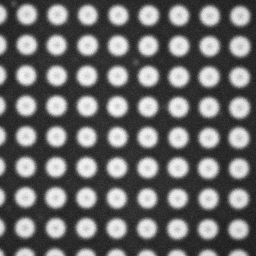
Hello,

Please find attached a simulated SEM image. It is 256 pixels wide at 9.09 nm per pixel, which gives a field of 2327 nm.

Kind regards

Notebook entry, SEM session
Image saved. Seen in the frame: an array of small figures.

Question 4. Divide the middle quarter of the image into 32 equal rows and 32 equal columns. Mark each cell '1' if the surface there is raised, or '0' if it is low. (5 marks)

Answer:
00000000000000000000000000000000
00001111000011100001111000011100
10011111000111110001111000111110
10011111000111110001111000111110
00001111000011100001111000011110
00000000000000000000000000001000
00000000000000000000000000000000
00000000000000000000000000000000
00000110000011100000110000001000
00001111000111100001111000011110
00011111000111110001111000111110
00001111000111110001111000111110
00001110000011100001111000011100
00000000000000000000000000000000
00000000000000000000000000000000
00000000000000000000000000000000
00001110000011100001110000011100
00001111000111110001111000111110
00001111000111110001111000111110
00001111000111100001111000111110
00000110000001000000110000011100
00000000000000000000000000000000
00000000000000000000000000000000
00000000000000000000000000000000
00001111000111100001111000011100
00011111000111110001111000111110
00011111000111110001111000111110
00001110000111100001111000011100
00000000000000000000000000000000
00000000000000000000000000000000
00000000000000000000000000000000
00001110000011000000110000001000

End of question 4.